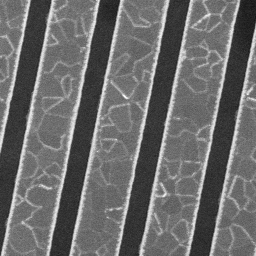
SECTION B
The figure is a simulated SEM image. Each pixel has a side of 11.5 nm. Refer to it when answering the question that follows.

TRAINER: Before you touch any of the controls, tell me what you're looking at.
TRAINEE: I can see lines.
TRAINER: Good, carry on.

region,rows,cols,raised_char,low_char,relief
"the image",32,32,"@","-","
@@@@--@@@@@@---@@@@@@---@@@@@@--
@@@---@@@@@@---@@@@@@--@@@@@@@--
@@@---@@@@@@--@@@@@@@--@@@@@@---
@@@---@@@@@@--@@@@@@@--@@@@@@---
@@@---@@@@@@--@@@@@@---@@@@@@---
@@@--@@@@@@---@@@@@@---@@@@@@--@
@@---@@@@@@---@@@@@@--@@@@@@@--@
@@---@@@@@@---@@@@@@--@@@@@@---@
@@---@@@@@@--@@@@@@---@@@@@@---@
@@---@@@@@@--@@@@@@---@@@@@@---@
@@--@@@@@@---@@@@@@---@@@@@@--@@
@@--@@@@@@---@@@@@@---@@@@@@--@@
@---@@@@@@---@@@@@@--@@@@@@---@@
@---@@@@@@--@@@@@@---@@@@@@---@@
@---@@@@@@--@@@@@@---@@@@@@---@@
@--@@@@@@---@@@@@@---@@@@@@---@@
@--@@@@@@---@@@@@@--@@@@@@@--@@@
---@@@@@@---@@@@@@--@@@@@@---@@@
---@@@@@@--@@@@@@---@@@@@@---@@@
---@@@@@@--@@@@@@---@@@@@@---@@@
--@@@@@@---@@@@@@---@@@@@@--@@@@
--@@@@@@---@@@@@@--@@@@@@@--@@@@
--@@@@@@---@@@@@@--@@@@@@@--@@@@
--@@@@@@--@@@@@@---@@@@@@---@@@@
--@@@@@@--@@@@@@---@@@@@@---@@@@
-@@@@@@---@@@@@@---@@@@@@--@@@@@
-@@@@@@---@@@@@@--@@@@@@@--@@@@@
-@@@@@@---@@@@@@--@@@@@@---@@@@@
-@@@@@@--@@@@@@---@@@@@@---@@@@@
-@@@@@@--@@@@@@---@@@@@@---@@@@@
@@@@@@---@@@@@@---@@@@@@--@@@@@@
@@@@@@---@@@@@@---@@@@@@--@@@@@@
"